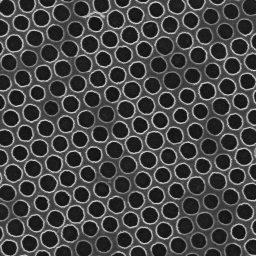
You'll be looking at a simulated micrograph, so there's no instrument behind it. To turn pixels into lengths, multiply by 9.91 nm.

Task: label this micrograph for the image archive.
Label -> a regular array of holes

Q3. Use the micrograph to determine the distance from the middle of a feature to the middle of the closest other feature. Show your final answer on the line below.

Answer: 201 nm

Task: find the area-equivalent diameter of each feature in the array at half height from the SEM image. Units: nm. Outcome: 154